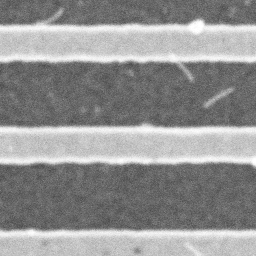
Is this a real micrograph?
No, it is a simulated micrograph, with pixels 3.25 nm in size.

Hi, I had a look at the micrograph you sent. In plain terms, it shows lines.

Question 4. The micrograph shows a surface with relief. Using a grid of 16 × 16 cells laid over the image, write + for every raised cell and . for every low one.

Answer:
................
............+...
++++++++++++++++
++++++++++++++++
................
................
................
................
++++++++++++++++
++++++++++++++++
................
................
................
................
.+++++++++++++++
++++++++++++++++